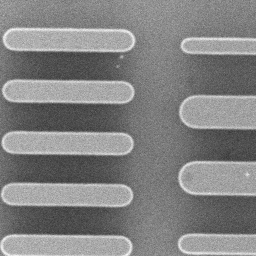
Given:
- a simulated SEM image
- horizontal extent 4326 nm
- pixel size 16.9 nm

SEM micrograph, groups of lines, slits or small figures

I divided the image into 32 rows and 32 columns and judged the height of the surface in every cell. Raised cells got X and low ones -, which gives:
--------------------------------
--------------------------------
--------------------------------
--------------------------------
-XXXXXXXXXXXXXXXX---------------
-XXXXXXXXXXXXXXXX------XXXXXXXXX
-----------------------XXXXXXXXX
--------------------------------
--------------------------------
--------------------------------
-XXXXXXXXXXXXXXX----------------
XXXXXXXXXXXXXXXXX---------------
-XXXXXXXXXXXXXXX-------XXXXXXXXX
-----------------------XXXXXXXXX
-----------------------XXXXXXXXX
-----------------------XXXXXXXXX
--------------------------------
XXXXXXXXXXXXXXXX----------------
-XXXXXXXXXXXXXXX----------------
--------------------------------
-----------------------XXXXXXXXX
-----------------------XXXXXXXXX
----------------------XXXXXXXXXX
-XXXXXXXXXXXXXXX-------XXXXXXXXX
XXXXXXXXXXXXXXXX----------------
-XXXXXXXXXXXXXXX----------------
--------------------------------
--------------------------------
--------------------------------
-XXXXXX----------------XXXXXXXXX
XXXXXXXXXXXXXXXX------XXXXXXXXXX
XXXXXXXXXXXXXXXX-------XXXXXXXXX